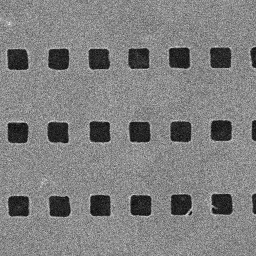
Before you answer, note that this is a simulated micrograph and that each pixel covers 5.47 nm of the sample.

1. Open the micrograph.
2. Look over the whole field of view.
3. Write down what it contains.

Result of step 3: a regular array of holes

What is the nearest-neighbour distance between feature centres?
222 nanometres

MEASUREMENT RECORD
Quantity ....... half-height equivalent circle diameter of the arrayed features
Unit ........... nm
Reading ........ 127